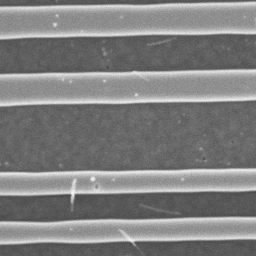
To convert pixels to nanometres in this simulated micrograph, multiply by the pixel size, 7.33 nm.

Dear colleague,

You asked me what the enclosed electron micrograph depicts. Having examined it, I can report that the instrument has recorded groups of lines, slits or small figures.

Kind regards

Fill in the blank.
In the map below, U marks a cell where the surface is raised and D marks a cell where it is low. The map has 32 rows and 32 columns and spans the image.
DDDDDDDDDDDDDDDDDDDDDUUUUUUUUUUU
UUUUUUUUUUUUUUUUUUUUUUUUUUUUUUUU
UUUUUUUUUUUUUUUUUUUUUUUUUUUUUUUU
UUUUUUUUUUUUUUUUUUUUUUUUUUUUUUUU
UUUUUUUUUUUUUUDDDDDDDDDDDDDDDDDD
DDDDDDDDDDDDDDDDDDDDDDDDDDDDDDDD
DDDDDDDDDDDDDDDDDDDDDDDDDDDDDDDD
DDDDDDDDDDDDDDDDDDDDDDDDDDDDDDDD
DDDDDDDDDDDDDDDDDDDDDDDDDDDDDDDD
UUUUUUUUUUUUUUUUUUUUUUUUUUUUUUUU
UUUUUUUUUUUUUUUUUUUUUUUUUUUUUUUU
UUUUUUUUUUUUUUUUUUUUUUUUUUUUUUUU
UUUUUUUUUUUUUUUUUUUUUUUUUUUUUUUD
DDDDDDDDDDDDDDDDDDDDDDDDDDDDDDDD
DDDDDDDDDDDDDDDDDDDDDDDDDDDDDDDD
DDDDDDDDDDDDDDDDDDDDDDDDDDDDDDDD
DDDDDDDDDDDDDDDDDDDDDDDDDDDDDDDD
DDDDDDDDDDDDDDDDDDDDDDDDDDDDDDDD
DDDDDDDDDDDDDDDDDDDDDDDDDDDDDDDD
DDDDDDDDDDDDDDDDDDDDDDDDDDDDDDDD
DDDDDDDDDDDDDDDDDDDDDDDDDDDDDDDD
DDDDDDDDDUUUUUUUUUUUUUUUUUUUUUUU
UUUUUUUUUUUUUUUUUUUUUUUUUUUUUUUU
UUUUUUUUUUUUUUUUUUUUUUUUUUUUUUUU
DDDDDDDDDDDDDDDDDDDDDDDDDDDDDDDD
DDDDDDDDDDDDDDDDDDDDDDDDDDDDDDDD
DDDDDDDDDDDDDDDDDDDDDDDDDDDDDDDD
DDDDDDDDDDDDDDDDDDDUUUUUUUUUUUUU
UUUUUUUUUUUUUUUUUUUUUUUUUUUUUUUU
UUUUUUUUUUUUUUUUUUUUUUUUUUUUUUUU
DDDDDDDDDDDDDDDDDDDDDDDDDDDDDDDD
DDDDDDDDDDDDDDDDDDDDDDDDDDDDDDDD